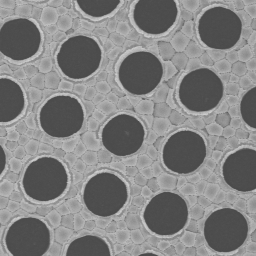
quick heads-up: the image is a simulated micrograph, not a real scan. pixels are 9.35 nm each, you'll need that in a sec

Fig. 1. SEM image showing a regular array of holes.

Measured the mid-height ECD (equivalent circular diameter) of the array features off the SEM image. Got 0.404 microns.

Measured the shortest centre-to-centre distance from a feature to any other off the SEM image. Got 0.579 µm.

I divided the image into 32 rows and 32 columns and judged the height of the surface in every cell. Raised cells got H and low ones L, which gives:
HHHHHHHHHHLLLLLHHLLLLLHHHHHHHHHH
HHHHHHHHHHHLLLHHHLLLLLHHHHLLLHHH
HHLLHHHHHHHHHHHHHLLLLLHHHLLLLLHH
LLLLLHHHHHHHHHHHHHLLLHHHHLLLLLHH
LLLLLHHHHHHHHHHHHHHHHHHHHLLLLLHH
LLLLLHHHLLLLHHHHHHHHHHHHHHLLLHHH
LLLLLHHLLLLLLHHHHLHHHHHHHHHHHHHH
HHLHHHHLLLLLLHHLLLLLHHHHHHHHHHHH
HHHHHHHHLLLLHHHLLLLLHHHHHHHHHHHH
HHHHHHHHLLLHHHHLLLLLHHHLLLLHHHHH
LLHHHHHHHHHHHHHLLLLLHHHLLLLLHHHH
LLLHHHHHHHHHHHHHLLLHHHLLLLLLHHHL
LLLHHHLLLLHHHHHHHHHHHHHLLLLLHHLL
LLLHHLLLLLHHHHHHHHHHHHHLLLLHHHLL
LLHHHLLLLLHHHHHLHHHHHHHHHHHHHHLL
HHHHHLLLLLHHHLLLLLHHHHHHHHHHHHHL
HHHHHHLLLLHHHLLLLLHHHHLLHHHHHHHH
HHHHHHHHHHHHHLLLLLHHHLLLLHHHHHHH
HHHHHHHHHHHHHLLLLHHHLLLLLLHHHHHH
LHHHHHHHHHHHHHHHHHHHLLLLLLHHHLLL
LHHHLLLLHHHHHHHHHHHHHLLLLHHHLLLL
HHHLLLLLHHHHHHHHHHHHHHLLHHHHLLLL
HHHLLLLLHHHLLLLHHHHHHHHHHHHHLLLL
HHHLLLLLHHHLLLLLHHHHHHHHHHHHHLLL
HHHHLLLHHHLLLLLLHHHLLLHHHHHHHHHH
HHHHHHHHHHHLLLLLHHHLLLLHHHHHHHHH
HHHHHHHHHHHLLLLHHHLLLLLHHHHLLLHH
HHLLLHHHHHHHHHHHHHLLLLLHHHLLLLLH
HLLLLLHHHHHHHHHHHHHLLLLHHHLLLLLH
HLLLLLHHHHHLHHHHHHHHHHHHHHLLLLLH
HLLLLLHHHLLLLHHHHHHHHHHHHHLLLLHH
HLLLLLHHLLLLLLHHHHHHHHHHHHHHHHHH